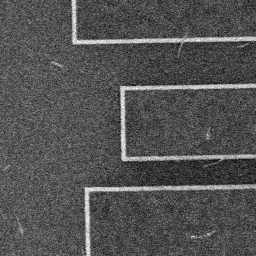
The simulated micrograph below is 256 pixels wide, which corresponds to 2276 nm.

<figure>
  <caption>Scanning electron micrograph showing one or a few lines or trenches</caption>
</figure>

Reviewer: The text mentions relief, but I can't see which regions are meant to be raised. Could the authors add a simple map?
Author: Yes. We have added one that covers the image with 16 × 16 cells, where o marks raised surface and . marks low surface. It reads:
.....ooooooooooo
.....ooooooooooo
.....ooooooo....
................
................
........o.oooooo
........oooooooo
........oooooooo
........oooooooo
........oooooooo
................
................
.....ooooooooooo
.....ooooooooooo
.....ooooooooooo
......oooooooooo